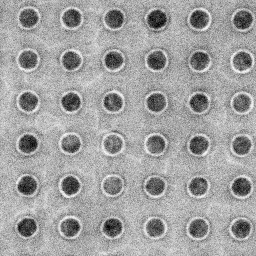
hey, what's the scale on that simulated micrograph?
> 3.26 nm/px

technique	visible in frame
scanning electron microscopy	a regular array of raised bodies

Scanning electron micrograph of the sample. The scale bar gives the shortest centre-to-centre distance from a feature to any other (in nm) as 136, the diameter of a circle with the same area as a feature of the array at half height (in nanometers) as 72.7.